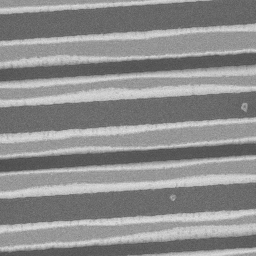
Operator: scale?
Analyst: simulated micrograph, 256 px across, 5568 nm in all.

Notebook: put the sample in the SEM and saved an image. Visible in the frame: lines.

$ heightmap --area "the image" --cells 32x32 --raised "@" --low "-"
@@@@@@@@@@@@@@@@@---------------
@-------------------------------
--------------------------------
--------------------------@@@@@@
------------@@@@@@@@@@@@@@@@@@@@
@@@@@@@@@@@@@@@@@@@@@@@@@@@@@@@@
@@@@@@@@@@@@@@@@@@@@@@@@@@@@@@@-
@@@@@@@@@@@@@@@-----------------
-------------------------------@
-------------@@@@@@@@@@@@@@@@@@@
@@@@@@@@@@@@@@@@@@@@@@@@@@@@@@@@
@@@@@@@@@@@@@@@@@@@@@@@@--------
@@@@@@@@@-----------------------
--------------------------------
--------------------------------
-----------------------@@@@@@@@@
--------@@@@@@@@@@@@@@@@@@@@@@@@
@@@@@@@@@@@@@@@@@@@@@@@@@@@@@@@@
@@@@@@@@@@@@@@@@@@@@------------
@@@@----------------------------
-------------------@@@@@@@@@@@@@
--@@@@@@@@@@@@@@@@@@@@@@@@@@@@@@
@@@@@@@@@@@@@@@@@@@@@@@@@@@@@@@@
@@@@@@@@@@@@@@@@@---------------
@@------------------------------
--------------------------------
------------------------------@@
---------------@@@@@@@@@@@@@@@@@
@@@@@@@@@@@@@@@@@@@@@@@@@@@@@@@@
@@@@@@@@@@@@@@@@@@@@@@----------
@@@@@@@@@@@@--------------------
--------------------------@@@@@@